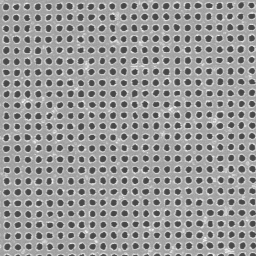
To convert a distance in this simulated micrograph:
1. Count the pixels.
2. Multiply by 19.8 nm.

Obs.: a regular array of holes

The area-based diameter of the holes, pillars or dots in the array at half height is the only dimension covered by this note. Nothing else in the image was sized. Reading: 124 nm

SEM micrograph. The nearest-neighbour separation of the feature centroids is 10.4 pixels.